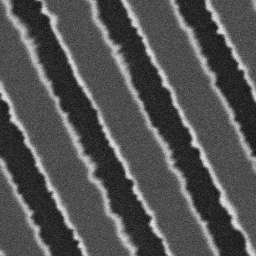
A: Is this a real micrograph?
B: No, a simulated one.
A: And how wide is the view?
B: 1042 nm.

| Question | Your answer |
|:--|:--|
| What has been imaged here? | lines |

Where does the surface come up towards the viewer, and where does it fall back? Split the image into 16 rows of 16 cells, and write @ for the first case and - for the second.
@--@@@--@@@--@@@
@--@@@--@@@---@@
@@--@@@--@@@--@@
@@--@@@--@@@@--@
@@@--@@@--@@@--@
@@@--@@@--@@@@--
@@@@--@@@--@@@--
-@@@--@@@--@@@@-
-@@@@--@@@--@@@-
--@@@--@@@--@@@@
--@@@@--@@@--@@@
@--@@@--@@@--@@@
@--@@@@--@@@--@@
@@--@@@--@@@--@@
@@---@@@--@@@--@
@@@--@@@--@@@--@